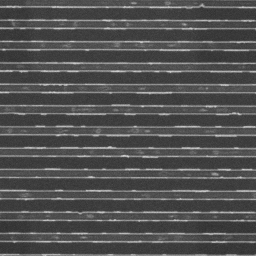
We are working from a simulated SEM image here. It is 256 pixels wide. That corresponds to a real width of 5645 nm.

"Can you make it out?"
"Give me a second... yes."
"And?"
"parallel lines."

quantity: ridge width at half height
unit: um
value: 0.303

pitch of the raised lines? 0.47 um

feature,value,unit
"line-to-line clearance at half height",168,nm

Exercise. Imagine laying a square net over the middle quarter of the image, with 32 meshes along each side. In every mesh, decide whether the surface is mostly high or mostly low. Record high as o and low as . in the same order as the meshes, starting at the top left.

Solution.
................................
................................
oooooooooooooooooooooooooooooooo
oooooooooooooooooooooooooooooooo
oooooooooooooooooooooooooooooooo
................................
................................
oooooooooooooooooooooooooooooooo
oooooooooooooooooooooooooooooooo
oooooooooooooooooooooooooooooooo
...................o....o.......
................................
oooooooooooooooooooooooooooooooo
oooooooooooooooooooooooooooooooo
oooooooooooooooooooooooooooooooo
oooooooooooooooooooooooooooooooo
................................
................................
oooooooooooooooooooooooooooooooo
oooooooooooooooooooooooooooooooo
oooooooooooooooooooooooooooooooo
................................
................................
oooooooooooooooooooooooooooooooo
oooooooooooooooooooooooooooooooo
oooooooooooooooooooooooooooooooo
................o..........ooooo
................................
oooooooooooooooooooooooooooooooo
oooooooooooooooooooooooooooooooo
oooooooooooooooooooooooooooooooo
oooooooooooooooooooooooooooooooo